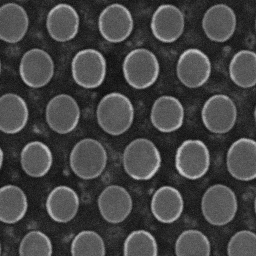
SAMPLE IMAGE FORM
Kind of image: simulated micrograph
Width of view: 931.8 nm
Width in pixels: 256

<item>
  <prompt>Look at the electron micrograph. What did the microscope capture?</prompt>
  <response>a regular array of raised bodies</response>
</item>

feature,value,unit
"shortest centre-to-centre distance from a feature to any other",51.8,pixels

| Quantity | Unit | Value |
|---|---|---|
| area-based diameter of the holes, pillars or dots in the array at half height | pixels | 35.5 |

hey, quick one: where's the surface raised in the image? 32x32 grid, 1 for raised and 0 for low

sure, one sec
00000000000000000000000000000000
11100011100001110000111000111000
11100011110011110001111001111000
11100011110011110001111001111000
11100001100001110000110000111000
00000000000000000000000000000000
00011100001100000110000110000010
00011100011110001111001111000111
00011110011110011111001111000111
00011100011110001111001111000111
00011100001100001110000110000011
00000000000000000000000000000000
11100011100001110000110000111000
11100011110011111001111001111000
11100011110011111001111001111000
11100011110001110001111000111000
01000001000001100000000000010000
00000000000100000100000000000010
00011100011110001110001111000111
00011100011110001111001111001111
00011100011110001111001111001111
00011100011110001110001111000111
00000000000000000000000000000010
11000001100001100000100000110000
11100011110011110001111000111000
11100011110011110001111001111000
11100011100001110001111001111000
11000001100001100000110000111000
00000000000000000000000000000000
00011100001100001110000111000111
00011100011110001111001111000111
00011100011110001111001111000111